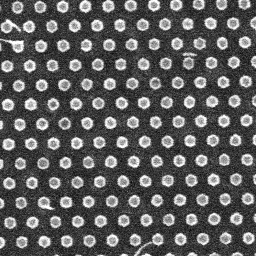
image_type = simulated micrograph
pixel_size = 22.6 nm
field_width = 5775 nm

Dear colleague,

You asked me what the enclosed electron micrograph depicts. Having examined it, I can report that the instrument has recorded a regular array of raised bodies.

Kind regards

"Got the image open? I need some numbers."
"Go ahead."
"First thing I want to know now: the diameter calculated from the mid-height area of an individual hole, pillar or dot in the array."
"10.2 px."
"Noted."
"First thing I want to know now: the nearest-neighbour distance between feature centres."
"500 nm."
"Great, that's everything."